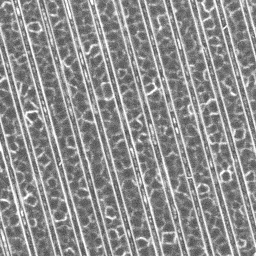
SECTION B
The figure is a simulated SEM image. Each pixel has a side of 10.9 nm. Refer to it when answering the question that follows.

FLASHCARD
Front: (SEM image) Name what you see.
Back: parallel lines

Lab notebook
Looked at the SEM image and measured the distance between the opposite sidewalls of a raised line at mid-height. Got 207 nm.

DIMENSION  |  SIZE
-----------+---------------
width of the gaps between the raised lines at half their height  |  61.6 nanometers